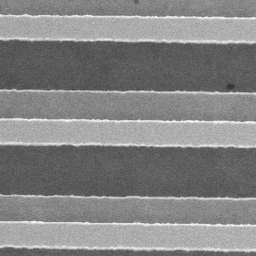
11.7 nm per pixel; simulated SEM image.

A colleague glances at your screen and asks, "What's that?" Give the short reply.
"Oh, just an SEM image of lines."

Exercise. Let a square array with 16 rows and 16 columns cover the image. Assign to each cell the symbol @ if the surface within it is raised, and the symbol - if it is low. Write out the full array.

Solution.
@@@@@@@@@@@@@@@@
@@@@@@@@@@@@@@@@
-----@-@@@@@@@@@
----------------
----------------
----------------
@@@@@@@@@@@@@@@@
@@@@@@@@@@@@@@@@
@@@@@@@@@@@@@@@@
----------------
----------------
----------------
@@@@@@@@@@@@@@@@
@@@@@@@@@@@@@@@@
@@@@@@@@@@@@@@@@
------@@@@@@@@@@